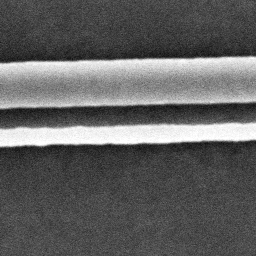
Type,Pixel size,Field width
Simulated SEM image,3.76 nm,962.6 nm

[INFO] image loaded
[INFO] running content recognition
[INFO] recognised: lines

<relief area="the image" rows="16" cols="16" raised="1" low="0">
0000000000000000
0000000000000000
0000000000000000
0000000000000000
1111111111111111
1111111111111111
1111111111111111
1111111111111111
1111111111111111
0000000000000000
0000000000000000
0000000000000000
0000000000000000
0000000000000000
0000000000000000
0000000000000000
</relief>